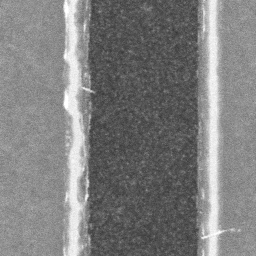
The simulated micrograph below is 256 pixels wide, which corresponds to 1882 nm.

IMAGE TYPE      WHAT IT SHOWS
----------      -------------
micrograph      one or a few lines or trenches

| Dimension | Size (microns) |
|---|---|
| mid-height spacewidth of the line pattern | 1.02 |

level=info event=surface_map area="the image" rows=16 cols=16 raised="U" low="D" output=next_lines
UUUUUDDDDDDDDUUU
UUUUUDDDDDDDDUUU
UUUUUDDDDDDDDUUU
UUUUDDDDDDDDDUUU
UUUUUDDDDDDDDUUU
UUUUUDDDDDDDDUUU
UUUUUDDDDDDDDUUU
UUUUUDDDDDDDDUUU
UUUUUDDDDDDDDUUU
UUUUUDDDDDDDDUUU
UUUUUDDDDDDDDUUU
UUUUUDDDDDDDDUUU
UUUUUDDDDDDDDUUU
UUUUUDDDDDDDDUUU
UUUUUDDDDDDDDUUU
UUUUUDDDDDDDDUUU